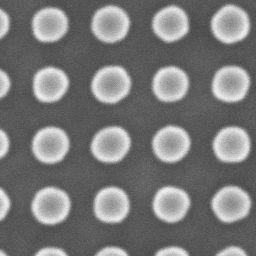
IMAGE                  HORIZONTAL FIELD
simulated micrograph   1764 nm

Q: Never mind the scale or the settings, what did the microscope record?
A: a regular array of raised bodies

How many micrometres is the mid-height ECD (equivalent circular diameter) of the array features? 0.237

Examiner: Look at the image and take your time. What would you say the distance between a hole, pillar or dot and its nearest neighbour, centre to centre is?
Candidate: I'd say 0.412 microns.